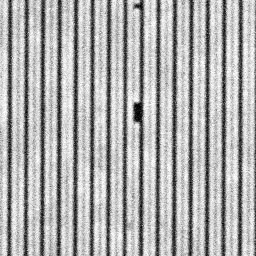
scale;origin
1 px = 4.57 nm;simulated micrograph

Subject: parallel lines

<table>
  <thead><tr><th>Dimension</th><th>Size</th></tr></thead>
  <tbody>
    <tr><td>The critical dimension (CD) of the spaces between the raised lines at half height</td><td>19.4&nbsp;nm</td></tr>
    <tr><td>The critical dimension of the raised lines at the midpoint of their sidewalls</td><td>22.9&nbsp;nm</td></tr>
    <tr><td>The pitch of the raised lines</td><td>37.7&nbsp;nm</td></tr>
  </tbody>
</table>